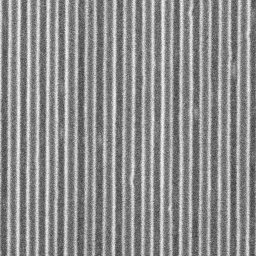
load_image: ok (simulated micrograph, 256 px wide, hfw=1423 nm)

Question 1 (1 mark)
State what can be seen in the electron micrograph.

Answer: parallel lines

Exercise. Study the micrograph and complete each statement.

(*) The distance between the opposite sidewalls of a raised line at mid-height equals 60.4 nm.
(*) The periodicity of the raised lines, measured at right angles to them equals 106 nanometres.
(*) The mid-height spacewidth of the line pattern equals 46.6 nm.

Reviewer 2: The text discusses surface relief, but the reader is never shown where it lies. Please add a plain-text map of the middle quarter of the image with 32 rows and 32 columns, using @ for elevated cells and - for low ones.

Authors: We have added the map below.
-@@--@@@--@@@--@@---@@---@@--@@@
-@@--@@@--@@@--@@---@@---@@--@@@
-@@--@@@--@@@--@@---@@---@@--@@@
-@@--@@@--@@@--@@---@@---@@--@@@
-@@--@@@--@@@--@@---@@---@@--@@@
-@@--@@@--@@@--@@---@@---@@--@@@
-@@--@@@--@@@--@@---@@---@@--@@@
@@@--@@@--@@@--@@---@@---@@--@@@
@@@--@@@--@@@--@@---@@---@@--@@@
@@@--@@@--@@@--@@---@@---@@--@@@
@@@--@@@--@@@--@@---@@---@@--@@@
@@@--@@@--@@@--@@---@@---@@--@@@
@@@--@@@--@@@--@@---@@---@@--@@@
@@@--@@@--@@@--@@---@@---@@--@@@
@@@--@@@--@@@--@@---@@---@@--@@@
@@@--@@@--@@@--@@---@@---@@--@@@
@@@--@@@--@@@--@@---@@---@@--@@@
@@@--@@@--@@@--@@---@@---@@--@@@
@@@--@@@--@@@--@@---@@---@@--@@@
@@@--@@@--@@@--@@---@@---@@--@@@
@@@--@@@--@@@--@@---@@---@@--@@@
@@@--@@@--@@@--@@---@@--@@@--@@@
@@@--@@@--@@@--@@---@@--@@@--@@@
@@@--@@@--@@@--@@---@@--@@@--@@@
@@@--@@@--@@@--@@---@@--@@@--@@@
@@@--@@@--@@@--@@---@@--@@@--@@@
@@@--@@@--@@@--@@---@@--@@@--@@@
@@@--@@@--@@@--@@---@@---@@--@@@
@@@--@@@--@@@--@@---@@---@@--@@@
@@@--@@@--@@@--@@---@@---@@--@@@
@@@--@@@--@@@--@@---@@---@@--@@@
@@@--@@@--@@@--@@---@@---@@--@@@